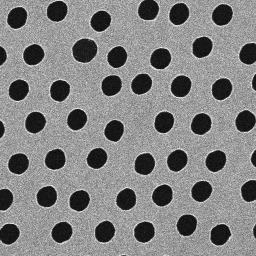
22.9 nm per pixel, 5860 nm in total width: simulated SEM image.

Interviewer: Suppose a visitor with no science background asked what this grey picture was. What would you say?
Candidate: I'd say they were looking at a regular array of holes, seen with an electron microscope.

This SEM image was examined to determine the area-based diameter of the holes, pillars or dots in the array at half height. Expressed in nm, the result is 482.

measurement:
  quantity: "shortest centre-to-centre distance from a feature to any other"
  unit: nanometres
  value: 792